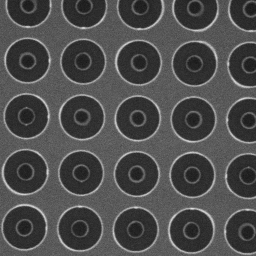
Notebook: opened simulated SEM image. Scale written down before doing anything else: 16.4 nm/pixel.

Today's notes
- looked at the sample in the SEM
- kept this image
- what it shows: an array of small figures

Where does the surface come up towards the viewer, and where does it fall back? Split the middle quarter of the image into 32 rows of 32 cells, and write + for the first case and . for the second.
...+++....+++....++++...+++....+
..........+++...........+++.....
.........+++++.........+++++....
+.......+++++++........+++++....
+++....+++++++++......++++++++..
++++++++++++++++++++++++++++++++
++++++++++++++++++++++++++++++++
++++++++++++++++++++++++++++++++
++.....+++++++++.....++++++++++.
+.......+++++++.......+++++++...
.........+++++.........+++++....
..........+++...........+++.....
...+++....+++....+++....+++....+
...+++....+++....+++....+++....+
...+++....+++....+++....+++....+
..........+++...........+++....+
.........+++++.........++++.....
+.......++++++.........+++++....
++....++++++++++.....++++++++...
++++++++++++++++++++++++++++++++
++++++++++++++++++++++++++++++++
++++++++++++++++++++++++++++++++
+......+++++++++.....+++++++++..
........++++++........+++++++...
.........++++..........+++++....
...++....++++..........++++.....
...+++....+++....+++....+++....+
..++++....+++...++++....+++...++
...+++....+++....+++....+++...++
.........++++..........++++....+
.........+++++.........++++.....
+.......++++++........++++++....